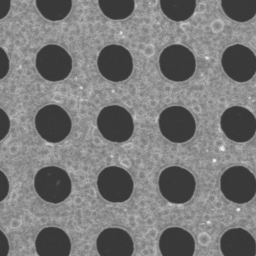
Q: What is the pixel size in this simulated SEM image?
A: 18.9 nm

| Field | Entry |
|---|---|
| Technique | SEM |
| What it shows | a regular array of holes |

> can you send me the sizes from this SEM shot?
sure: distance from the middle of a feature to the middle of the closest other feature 60.5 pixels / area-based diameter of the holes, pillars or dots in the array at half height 37.5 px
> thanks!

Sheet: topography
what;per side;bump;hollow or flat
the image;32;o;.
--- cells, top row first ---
.oooo....ooo.....ooo.....ooo....
.oooo....oooo....ooo....oooo....
oooooo..oooooo.ooooooo.oooooo..o
oooooooooooooooooooooooooooooooo
oooooooooooooooooooooooooooooooo
oooooooooooooooooooooooooooooooo
.oooo...ooooo...oooo....oooo....
.oooo....ooo.....ooo....oooo....
.oooo....ooo.....ooo....oooo....
.oooo...ooooo...ooooo...ooooo...
oooooooooooooooooooooooooooooooo
oooooooooooooooooooooooooooooooo
oooooooooooooooooooooooooooooooo
ooooo...ooooo...ooooo..oooooo..o
.ooo.....ooo....oooo....oooo....
.ooo.....ooo.....ooo....oooo....
.oooo....ooo.....ooo....oooo....
oooooo..ooooo...ooooo...ooooo..o
oooooooooooooooooooooooooooooooo
oooooooooooooooooooooooooooooooo
oooooooooooooooooooooooooooooooo
ooooo...ooooo...oooo....oooo...o
.ooo.....ooo.....ooo....ooo.....
.ooo.....ooo.....ooo....oooo....
.oooo....oooo...oooo....oooo....
oooooooooooooooooooooo.ooooooooo
oooooooooooooooooooooooooooooooo
oooooooooooooooooooooooooooooooo
oooooo.oooooooooooooo..oooooo.oo
.oooo...oooo....oooo....oooo....
.ooo.....ooo.....ooo....ooo.....
.oooo....ooo.....ooo....oooo....